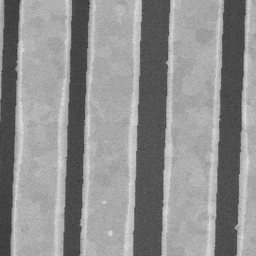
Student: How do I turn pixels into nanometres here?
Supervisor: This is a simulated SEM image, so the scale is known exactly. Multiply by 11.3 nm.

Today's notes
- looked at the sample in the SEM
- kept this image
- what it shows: lines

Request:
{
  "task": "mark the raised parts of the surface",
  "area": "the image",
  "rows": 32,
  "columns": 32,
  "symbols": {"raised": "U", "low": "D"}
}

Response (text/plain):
DDDUUUUUUDDDUUUUUDDDDUUUUUUUDDDU
DDDUUUUUUDDUUUUUUDDDDUUUUUUUDDDU
DDDUUUUUUDDUUUUUUDDDDUUUUUUUDDDU
DDUUUUUUUDDUUUUUUDDDDUUUUUUUDDDU
DDUUUUUUUDDUUUUUUDDDDUUUUUUDDDDU
DDUUUUUUUDDUUUUUUDDDDUUUUUUDDDDU
DDUUUUUUUDDUUUUUUDDDDUUUUUUDDDDU
DDUUUUUUDDDUUUUUUDDDDUUUUUUDDDDU
DDUUUUUUDDDUUUUUUDDDDUUUUUUDDDDU
DDUUUUUUDDDUUUUUUDDDDUUUUUUDDDDU
DDUUUUUUDDDUUUUUUDDDDUUUUUUDDDDU
DDUUUUUUDDDUUUUUUDDDDUUUUUUDDDDU
DDUUUUUUDDDUUUUUUDDDDUUUUUUDDDDU
DDUUUUUUDDDUUUUUUDDDDUUUUUUDDDDU
DDUUUUUUDDDUUUUUUDDDDUUUUUUDDDUU
DDUUUUUUDDDUUUUUUDDDDUUUUUUDDDDU
DDUUUUUUDDDUUUUUUDDDDUUUUUUDDDDU
DDUUUUUUDDDUUUUUUDDDDUUUUUUDDDDU
DDUUUUUUDDDUUUUUUDDDDUUUUUUDDDUU
DDUUUUUUDDDUUUUUUDDDDUUUUUUDDDDU
DDUUUUUUDDDUUUUUUDDDDUUUUUUDDDUU
DDUUUUUUDDDUUUUUUDDDDUUUUUUDDDUU
DDUUUUUUDDDUUUUUUDDDDUUUUUUDDDUU
DDUUUUUUDDDUUUUUUDDDDUUUUUUDDDUU
DDUUUUUUDDDUUUUUDDDDDUUUUUUDDDUU
DDUUUUUUDDDUUUUUDDDDDUUUUUUDDDUU
DDUUUUUUDDUUUUUUDDDDDUUUUUUDDDUU
DDUUUUUDDDUUUUUUDDDDDUUUUUUDDDUU
DDUUUUUDDDUUUUUUDDDDDUUUUUDDDDUU
DDUUUUUDDDUUUUUUDDDDDUUUUUDDDDUU
DDUUUUUDDDUUUUUUDDDDUUUUUUDDDDUU
DDUUUUUDDDUUUUUUDDDDUUUUUUDDDDUU